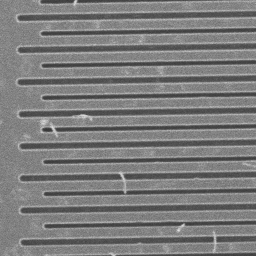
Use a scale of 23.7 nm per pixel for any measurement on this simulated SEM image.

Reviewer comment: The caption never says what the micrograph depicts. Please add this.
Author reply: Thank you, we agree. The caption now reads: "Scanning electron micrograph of parallel lines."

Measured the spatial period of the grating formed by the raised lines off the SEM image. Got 382 nanometers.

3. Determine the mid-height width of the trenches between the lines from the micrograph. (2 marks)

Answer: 6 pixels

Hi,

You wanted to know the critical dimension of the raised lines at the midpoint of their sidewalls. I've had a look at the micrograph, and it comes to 261 nanometres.